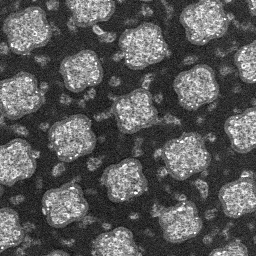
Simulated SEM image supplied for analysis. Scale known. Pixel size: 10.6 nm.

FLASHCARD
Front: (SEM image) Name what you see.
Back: a regular array of raised bodies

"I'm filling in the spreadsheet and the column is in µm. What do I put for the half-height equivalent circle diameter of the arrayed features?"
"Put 0.425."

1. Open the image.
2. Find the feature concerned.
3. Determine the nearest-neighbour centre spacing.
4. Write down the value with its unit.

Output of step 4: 703 nm